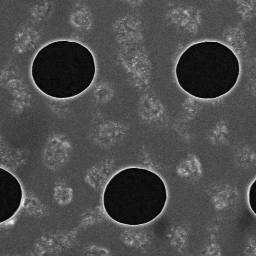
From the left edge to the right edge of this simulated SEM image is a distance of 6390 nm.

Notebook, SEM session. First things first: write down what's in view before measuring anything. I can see holes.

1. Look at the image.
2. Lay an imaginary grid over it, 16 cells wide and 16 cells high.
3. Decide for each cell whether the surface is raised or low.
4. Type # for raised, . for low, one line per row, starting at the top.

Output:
################
################
################
##....#####....#
##....#####....#
##...######...##
################
################
################
################
################
.######...######
.#####....######
.######...######
################
################